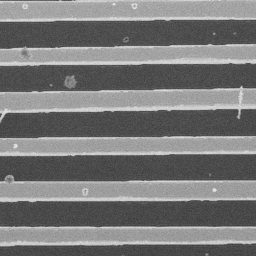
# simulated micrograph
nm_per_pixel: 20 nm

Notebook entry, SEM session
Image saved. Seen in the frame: lines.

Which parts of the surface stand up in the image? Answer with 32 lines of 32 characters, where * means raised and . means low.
********************************
********************************
****************................
................................
................................
................................
********************************
********************************
................................
................................
................................
....****************************
********************************
******************************..
................................
................................
................................
********************************
********************************
................................
................................
................................
.*..............................
********************************
********************************
................................
................................
................................
********************************
********************************
**********......................
................................